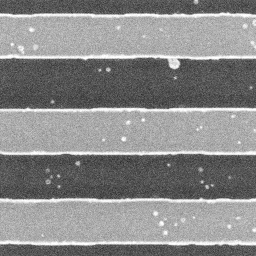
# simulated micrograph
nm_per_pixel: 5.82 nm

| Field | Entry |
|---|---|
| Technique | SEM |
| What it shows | lines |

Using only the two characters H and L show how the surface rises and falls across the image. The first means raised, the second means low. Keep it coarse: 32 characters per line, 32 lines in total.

LLLLLLLLLLLLLLLLLLLLLLLLLLLLLLLL
LLLLLLLLLLLLLLLLLLLLLLLLLLLLLLLL
HHHHHHHHHHHHHHHHHHHHHHHHHHHHHHHH
HHHHHHHHHHHHHHHHHHHHHHHHHHHHHHHH
HHHHHHHHHHHHHHHHHHHHHHHHHHHHHHHH
HHHHHHHHHHHHHHHHHHHHHHHHHHHHHHHH
HHHHHHHHHHHHHHHHHHHHHHHHHHHHHHHH
LLLLLLLLLLLLLLLLLLLLLLLLLLLLLLLL
LLLLLLLLLLLLLLLLLLLLLLLLLLLLLLLL
LLLLLLLLLLLLLLLLLLLLLLLLLLLLLLLL
LLLLLLLLLLLLLLLLLLLLLLLLLLLLLLLL
LLLLLLLLLLLLLLLLLLLLLLLLLLLLLLLL
LLLLLLLLLLLLLLLLLLLLLLLLLLLLLLLL
LLLLLLLLLLLLLLLLLLLLLLLLLLLLLLLL
HHHHHHHHHHHHHHHHHHHHHHHHHHHHHHHH
HHHHHHHHHHHHHHHHHHHHHHHHHHHHHHHH
HHHHHHHHHHHHHHHHHHHHHHHHHHHHHHHH
HHHHHHHHHHHHHHHHHHHHHHHHHHHHHHHH
HHHHHHHHHHHHHHHHHHHHHHHHHHHHHHHH
LLLLLLLLLLLLLLLLLLLLLLLLLLLLLLLL
LLLLLLLLLLLLLLLLLLLLLLLLLLLLLLLL
LLLLLLLLLLLLLLLLLLLLLLLLLLLLLLLL
LLLLLLLLLLLLLLLLLLLLLLLLLLLLLLLL
LLLLLLLLLLLLLLLLLLLLLLLLLLLLLLLL
LLLLLLLLLLLLLLLLLLLLLLLLLLLLLLLL
HHHHHHHHHHHHHHHHHHHHHHHHHHHHHHHH
HHHHHHHHHHHHHHHHHHHHHHHHHHHHHHHH
HHHHHHHHHHHHHHHHHHHHHHHHHHHHHHHH
HHHHHHHHHHHHHHHHHHHHHHHHHHHHHHHH
HHHHHHHHHHHHHHHHHHHHHHHHHHHHHHHH
LLLLLHHHLHHLLLLLLLLLLHHLLHHLLLHH
LLLLLLLLLLLLLLLLLLLLLLLLLLLLLLLL